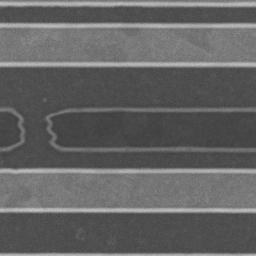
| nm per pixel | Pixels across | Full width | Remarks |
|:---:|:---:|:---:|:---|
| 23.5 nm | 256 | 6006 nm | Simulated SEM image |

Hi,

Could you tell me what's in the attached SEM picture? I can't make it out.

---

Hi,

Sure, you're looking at one or a few lines or trenches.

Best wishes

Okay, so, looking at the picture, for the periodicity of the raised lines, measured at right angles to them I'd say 1710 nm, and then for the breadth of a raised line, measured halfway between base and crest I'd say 927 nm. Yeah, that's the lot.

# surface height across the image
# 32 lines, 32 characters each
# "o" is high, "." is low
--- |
................................
................................
................................
oooooooooooooooooooooooooooooooo
oooooooooooooooooooooooooooooooo
oooooooooooooooooooooooooooooooo
oooooooooooooooooooooooooooooooo
oooooooooooooooooooooooooooooooo
................................
................................
................................
................................
................................
................................
oo....oooooooooooooooooooooooooo
ooo...oooooooooooooooooooooooooo
ooo...oooooooooooooooooooooooooo
ooo....ooooooooooooooooooooooooo
o.......oooooooooooooooooooooooo
................................
................................
oooooooooooooooooooooooooooooooo
oooooooooooooooooooooooooooooooo
oooooooooooooooooooooooooooooooo
oooooooooooooooooooooooooooooooo
oooooooooooooooooooooooooooooooo
................................
................................
................................
................................
................................
................................